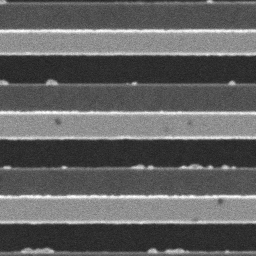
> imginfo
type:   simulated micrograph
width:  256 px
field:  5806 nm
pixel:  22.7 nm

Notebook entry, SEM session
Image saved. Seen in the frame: lines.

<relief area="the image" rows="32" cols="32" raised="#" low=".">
################################
################################
################################
################################
################################
################################
################################
................................
................................
................................
#....###.......##...........##..
################################
################################
################################
################################
################################
################################
................................
................................
................................
................................
################################
################################
################################
################################
################################
################################
################################
................................
................................
................................
..#####...........######.#######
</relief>